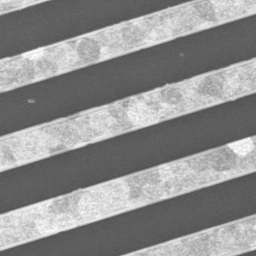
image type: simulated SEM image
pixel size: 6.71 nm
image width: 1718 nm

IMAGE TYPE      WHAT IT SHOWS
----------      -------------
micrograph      one or a few lines or trenches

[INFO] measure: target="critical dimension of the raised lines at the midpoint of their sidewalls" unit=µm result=0.196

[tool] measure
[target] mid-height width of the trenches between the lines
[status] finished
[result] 304 nm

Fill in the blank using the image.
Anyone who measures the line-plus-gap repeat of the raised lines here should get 501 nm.